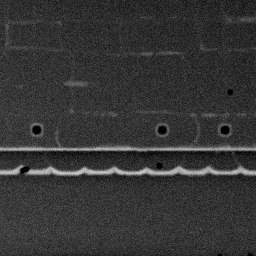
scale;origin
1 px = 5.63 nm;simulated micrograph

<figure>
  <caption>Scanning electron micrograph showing wiring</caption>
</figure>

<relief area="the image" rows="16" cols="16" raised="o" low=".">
oooooooooooooooo
oooooooooooooooo
oooooooooooooooo
oooooooooooooooo
oooooooooooooooo
oooooooooooooooo
oooooooooooooooo
oooooooooooooooo
oooooooooooooooo
................
................
................
................
................
................
................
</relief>